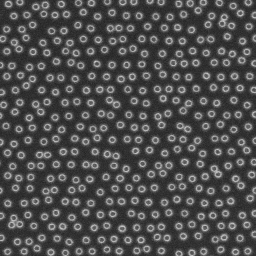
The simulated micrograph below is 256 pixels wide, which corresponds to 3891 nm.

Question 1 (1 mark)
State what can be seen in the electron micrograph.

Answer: a regular array of holes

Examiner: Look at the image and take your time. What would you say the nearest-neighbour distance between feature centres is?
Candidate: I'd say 173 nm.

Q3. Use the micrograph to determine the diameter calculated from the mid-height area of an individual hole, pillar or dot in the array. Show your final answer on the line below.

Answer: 74.7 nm